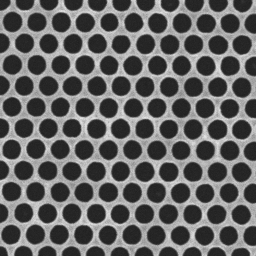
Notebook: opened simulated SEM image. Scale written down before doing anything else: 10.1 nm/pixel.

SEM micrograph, a regular array of holes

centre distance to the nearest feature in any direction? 0.241 micrometres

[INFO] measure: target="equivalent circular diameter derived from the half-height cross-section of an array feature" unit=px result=19.3